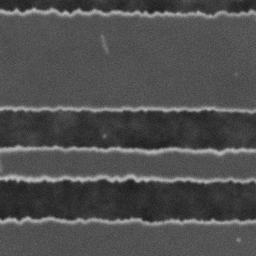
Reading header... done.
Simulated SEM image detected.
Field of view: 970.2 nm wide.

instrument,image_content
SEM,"lines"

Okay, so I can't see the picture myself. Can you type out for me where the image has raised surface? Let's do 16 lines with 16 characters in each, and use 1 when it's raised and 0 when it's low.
0000000000000000
1111111111111111
1111111111111111
1111111111111111
1111111111111111
1111111111111111
1111111111111111
0000000000000000
0000000000000000
1111111111111111
1111111111111111
0000000000000000
0000000000000000
0000000000000000
1111111111111111
1111111111111111